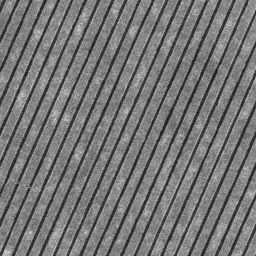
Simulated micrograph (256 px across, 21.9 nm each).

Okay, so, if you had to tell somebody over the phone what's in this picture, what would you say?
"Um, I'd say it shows parallel lines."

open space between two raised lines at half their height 75.2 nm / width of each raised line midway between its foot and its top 188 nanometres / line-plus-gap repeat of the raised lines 270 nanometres